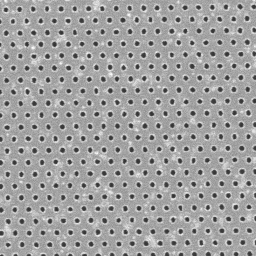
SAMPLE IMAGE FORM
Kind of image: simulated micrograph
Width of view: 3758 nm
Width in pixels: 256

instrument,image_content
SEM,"a regular array of holes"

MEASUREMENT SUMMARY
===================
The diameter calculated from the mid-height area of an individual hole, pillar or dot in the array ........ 77.7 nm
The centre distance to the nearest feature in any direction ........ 193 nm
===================